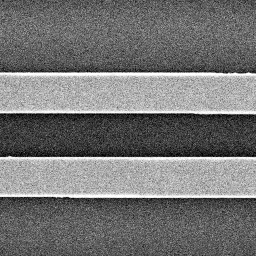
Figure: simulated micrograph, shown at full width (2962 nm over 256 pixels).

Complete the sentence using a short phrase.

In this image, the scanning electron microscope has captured lines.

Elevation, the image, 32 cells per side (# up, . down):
................................
................................
................................
................................
................................
................................
................................
................................
................................
################################
################################
################################
################################
################################
................................
................................
................................
................................
................................
................................
################################
################################
################################
################################
################################
................................
................................
................................
................................
................................
................................
................................